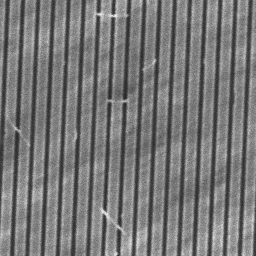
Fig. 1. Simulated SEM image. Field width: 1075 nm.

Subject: parallel lines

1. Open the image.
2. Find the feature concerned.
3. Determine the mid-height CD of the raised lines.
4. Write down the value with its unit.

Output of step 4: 43 nm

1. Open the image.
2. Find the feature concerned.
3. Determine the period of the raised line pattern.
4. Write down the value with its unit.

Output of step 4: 63.8 nm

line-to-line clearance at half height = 0.0178 um